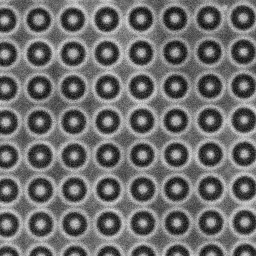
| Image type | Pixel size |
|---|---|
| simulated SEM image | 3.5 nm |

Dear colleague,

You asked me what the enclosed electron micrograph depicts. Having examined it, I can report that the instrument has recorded an array of small figures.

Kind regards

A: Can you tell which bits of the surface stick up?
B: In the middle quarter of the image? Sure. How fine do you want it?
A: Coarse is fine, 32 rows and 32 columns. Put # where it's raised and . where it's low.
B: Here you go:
#...#####...#######.############
################################
##########..#######.############
.....###.....####.....####....##
.....###......##......###......#
......#.......##.......##......#
......##......##.......##......#
.....###......##......###......#
....#####....####....#####...###
################################
################################
#...#####....####.....####....##
.....###......##.......##......#
......##......##.......##......#
......#.......##.......##......#
......##......##.......##......#
.....###......###.....####....##
#...######..######...######.####
################################
##.################.#######..###
.....####....####.....####....##
......##......###......##......#
......##......##.......##......#
......##......##.......##......#
......##......###.....###......#
.....####....#####...#####....##
##.#############################
################################
#...######...#####....####....##
.....###......###......##......#
......##......##.......##.......
......##.......#.......##.......